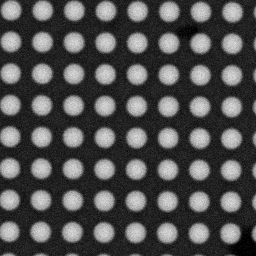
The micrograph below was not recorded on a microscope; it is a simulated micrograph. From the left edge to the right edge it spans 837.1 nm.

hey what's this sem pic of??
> an array of small figures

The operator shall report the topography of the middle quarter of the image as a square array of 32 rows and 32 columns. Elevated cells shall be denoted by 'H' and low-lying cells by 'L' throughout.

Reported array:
LHHHLLLLLHHHLLLLLHHLLLLLLHHLLLLL
HHHHHLLLHHHHHLLLHHHHLLLLHHHHLLLL
HHHHHLLLHHHHHLLLHHHHHLLLHHHHHLLL
HHHHHLLLHHHHHLLLHHHHHLLLHHHHHLLL
LHHHLLLLLHHHLLLLLHHHLLLLLHHHLLLL
LLLLLLLLLLLLLLLLLLLLLLLLLLLLLLLL
LLLLLLLLLLLLLLLLLLLLLLLLLLLLLLLL
LLLLLLLLLLLLLLLLLLLLLLLLLLLLLLLL
LHHHLLLLLHHHLLLLLHHHLLLLLHHLLLLL
HHHHHLLLHHHHHLLLHHHHLLLLHHHHLLLL
HHHHHLLLHHHHHLLLHHHHHLLLHHHHLLLL
HHHHHLLLHHHHLLLLHHHHHLLLHHHHLLLL
LHHHLLLLLHHHLLLLLHHHLLLLHHHHLLLL
LLLLLLLLLLLLLLLLLLLLLLLLLLLLLLLL
LLLLLLLLLLLLLLLLLLLLLLLLLLLLLLLL
LLLLLLLLLLLLLLLLLLLLLLLLLLLLLLLL
LHHHLLLLLHHHLLLLLHHHLLLLLHHLLLLL
HHHHHLLLHHHHHLLLHHHHLLLLHHHHLLLL
HHHHHLLLHHHHHLLLHHHHLLLLHHHHLLLL
HHHHHLLLHHHHLLLLHHHHLLLLHHHHLLLL
LHHHLLLLLHHLLLLLLHHHLLLLLHHHLLLL
LLLLLLLLLLLLLLLLLLLLLLLLLLLLLLLL
LLLLLLLLLLLLLLLLLLLLLLLLLLLLLLLL
LLLLLLLLLLLLLLLLLLLLLLLLLLLLLLLL
LHHHLLLLLHHHLLLLLHHHLLLLLHHLLLLL
HHHHHLLLHHHHHLLLHHHHLLLLHHHHLLLL
HHHHHLLLHHHHHLLLHHHHLLLLHHHHLLLH
HHHHLLLLHHHHLLLLHHHHLLLLHHHHLLLL
LHHLLLLLLHHLLLLLLHHLLLLLHHHLLLLL
LLLLLLLLLLLLLLLLLLLLLLLLLLLLLLLL
LLLLLLLLLLLLLLLLLLLLLLLLLLLLLLLL
LLLLLLLLLLLLLLLLLLLLLLLLLLLLLLLL